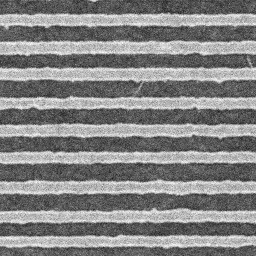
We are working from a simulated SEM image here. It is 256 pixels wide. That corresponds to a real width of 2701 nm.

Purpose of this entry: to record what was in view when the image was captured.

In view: parallel lines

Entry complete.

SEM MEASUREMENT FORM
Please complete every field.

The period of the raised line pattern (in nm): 292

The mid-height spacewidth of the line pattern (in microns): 0.187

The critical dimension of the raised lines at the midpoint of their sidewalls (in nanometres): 98.9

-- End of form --